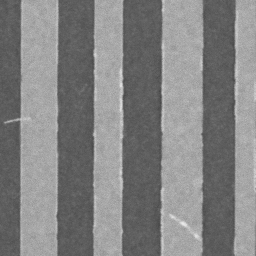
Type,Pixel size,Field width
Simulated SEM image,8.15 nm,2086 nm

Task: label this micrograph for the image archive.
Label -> one or a few lines or trenches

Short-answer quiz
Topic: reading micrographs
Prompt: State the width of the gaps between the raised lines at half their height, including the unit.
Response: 303 nm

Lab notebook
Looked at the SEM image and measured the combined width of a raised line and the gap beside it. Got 583 nm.